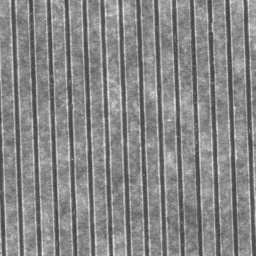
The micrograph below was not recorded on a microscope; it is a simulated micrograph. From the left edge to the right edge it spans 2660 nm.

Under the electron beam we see parallel lines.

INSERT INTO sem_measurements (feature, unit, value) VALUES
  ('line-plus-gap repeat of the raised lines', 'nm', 186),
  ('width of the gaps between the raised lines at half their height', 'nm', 51.9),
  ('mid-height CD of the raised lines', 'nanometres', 135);